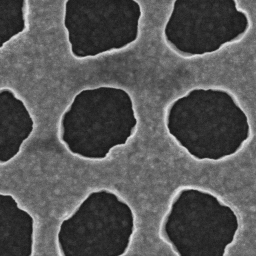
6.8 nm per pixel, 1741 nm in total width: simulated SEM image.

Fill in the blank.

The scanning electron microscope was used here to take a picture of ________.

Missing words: holes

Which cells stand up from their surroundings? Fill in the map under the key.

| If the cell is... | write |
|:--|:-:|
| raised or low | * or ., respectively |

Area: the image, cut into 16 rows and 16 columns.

..**.....**....*
..**.....*.....*
.***....**....**
*****.**********
****************
****************
.****...***....*
..**....**.....*
..**....***....*
.****..*****...*
****************
****************
.****...***...**
..**....***....*
..**....**.....*
..**....***...**